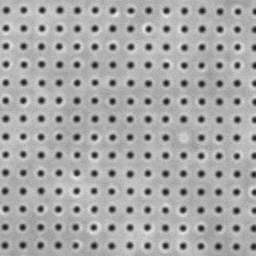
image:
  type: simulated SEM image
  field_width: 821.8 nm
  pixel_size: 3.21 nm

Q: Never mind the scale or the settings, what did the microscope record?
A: a regular array of holes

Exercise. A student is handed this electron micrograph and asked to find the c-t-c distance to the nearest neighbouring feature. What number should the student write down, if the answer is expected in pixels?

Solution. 17.6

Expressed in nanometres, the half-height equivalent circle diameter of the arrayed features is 22.1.